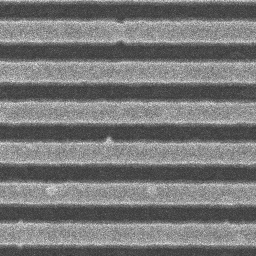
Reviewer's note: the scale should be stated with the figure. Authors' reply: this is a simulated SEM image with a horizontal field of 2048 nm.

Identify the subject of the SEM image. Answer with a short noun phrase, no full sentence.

parallel lines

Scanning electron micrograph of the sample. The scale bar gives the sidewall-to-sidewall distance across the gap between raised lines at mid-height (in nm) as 143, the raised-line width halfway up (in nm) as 185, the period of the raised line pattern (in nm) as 324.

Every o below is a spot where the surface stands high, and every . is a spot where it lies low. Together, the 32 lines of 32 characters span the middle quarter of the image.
oooooooooooooooooooooooooooooooo
oooooooooooooooooooooooooooooooo
oooooooooooooooooooooooooooooooo
oooooooooooooooooooooooooooooooo
oooooooooooooooooooooooooooooooo
................................
................................
................................
................................
ooooooooooooooooooooooooooooooo.
oooooooooooooooooooooooooooooooo
oooooooooooooooooooooooooooooooo
oooooooooooooooooooooooooooooooo
oooooooooooooooooooooooooooooooo
oooooooooooooooooooooooooooooooo
................................
................................
................................
...........o....................
oooooooooooooo.oo..o............
oooooooooooooooooooooooooooooooo
oooooooooooooooooooooooooooooooo
oooooooooooooooooooooooooooooooo
oooooooooooooooooooooooooooooooo
oooooooooooooooooooooooooooooooo
................................
................................
................................
................................
.oo.............................
oooooooooooooooooooooooooooooooo
oooooooooooooooooooooooooooooooo